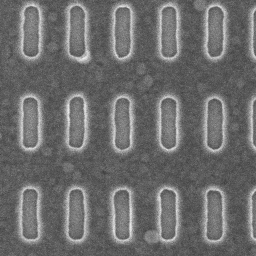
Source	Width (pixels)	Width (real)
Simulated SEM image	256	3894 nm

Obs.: a regular array of holes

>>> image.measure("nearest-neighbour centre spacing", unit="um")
0.7